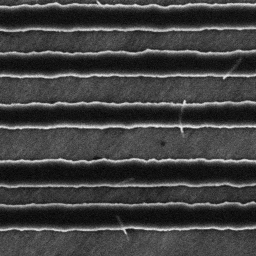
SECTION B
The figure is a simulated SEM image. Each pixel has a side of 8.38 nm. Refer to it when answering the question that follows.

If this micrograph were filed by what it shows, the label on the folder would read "lines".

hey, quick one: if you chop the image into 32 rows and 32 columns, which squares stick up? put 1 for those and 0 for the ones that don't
00000010010000000000000011001111
11111111111111111111111111111111
11111111111111111111111111111111
11111111111111111111111111111111
00000000000000000000000000000000
00000000000000000000000000000000
00000110000001110011111110000111
11111111111111111111111111111111
11111111111111111111111111111111
11111111011111111111111111111111
00000000000000000000000000000000
00000000000000000000000000000000
00000000000000000000000000000000
11111111111111111111111111111111
11111111111111111111111111111111
11111111111111111111111111111111
00000000000000000000000000000000
00000000000000000000000000000000
00000000000000000000000000000000
00000000000000000000000000000000
11111111111111111111111111111111
11111111111111111111111111111111
11111111111111111111111111111111
00000000000000000000000000000000
00000000000000000000000000000000
00001011001111100111111111111111
11111111111111111111111111111111
11111111111111111111111111111111
11111111111111111111111111111111
00000000000000000000000000000000
00000000000000000000000000000000
00000000000000000000000000000000